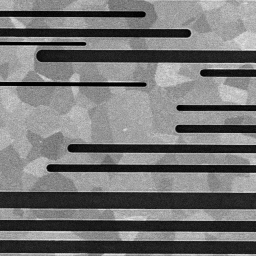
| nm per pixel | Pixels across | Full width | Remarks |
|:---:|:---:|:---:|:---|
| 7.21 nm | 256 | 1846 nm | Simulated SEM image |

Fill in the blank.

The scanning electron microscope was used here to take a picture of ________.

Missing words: groups of lines, slits or small figures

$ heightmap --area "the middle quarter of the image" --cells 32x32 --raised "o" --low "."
oooooooooooooooooooooooooooooooo
oooooooooooooooooooooooooooooooo
oooooooooooooooooooooooooooooooo
oooooooooooooooooooooooooooooooo
....................oooooooooooo
.....................ooooooooooo
oooooooooooooooooooooooooooooooo
oooooooooooooooooooooooooooooooo
oooooooooooooooooooooooooooooooo
oooooooooooooooooooooooooooooooo
oooooooooooooooooooooooooooo....
oooooooooooooooooooooooooooo....
oooooooooooooooooooooooooooooooo
oooooooooooooooooooooooooooooooo
oooooooooooooooooooooooooooooooo
oooooooooooooooooooooooooooo....
oooooooooooooooooooooooooooo....
oooooooooooooooooooooooooooooooo
oooooooooooooooooooooooooooooooo
oooooooooooooooooooooooooooooooo
o...............................
o...............................
oooooooooooooooooooooooooooooooo
oooooooooooooooooooooooooooooooo
oooooooooooooooooooooooooooooooo
................................
................................
oooooooooooooooooooooooooooooooo
oooooooooooooooooooooooooooooooo
oooooooooooooooooooooooooooooooo
oooooooooooooooooooooooooooooooo
oooooooooooooooooooooooooooooooo